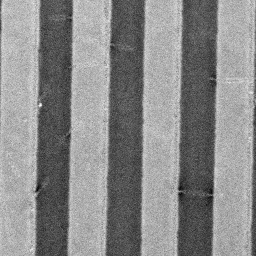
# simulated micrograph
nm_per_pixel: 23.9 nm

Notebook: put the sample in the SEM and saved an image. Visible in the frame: lines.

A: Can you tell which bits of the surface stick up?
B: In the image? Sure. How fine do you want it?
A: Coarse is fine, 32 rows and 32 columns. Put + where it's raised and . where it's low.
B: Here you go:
+++++....+++++....+++++....+++++
+++++....+++++....+++++....+++++
+++++....+++++....+++++....+++++
+++++....+++++....+++++....+++++
+++++....+++++....+++++....+++++
+++++....+++++....+++++....+++++
+++++....+++++....++++.....+++++
+++++....+++++....++++.....+++++
+++++....+++++....++++.....+++++
+++++....+++++....++++.....+++++
+++++....+++++....++++.....+++++
+++++....++++.....++++.....+++++
+++++....++++.....++++.....+++++
+++++....++++.....++++.....+++++
+++++....++++.....++++.....++++.
+++++....++++.....++++.....++++.
+++++....++++.....++++.....++++.
+++++....++++.....++++.....++++.
+++++....++++.....++++.....++++.
++++.....++++.....++++.....++++.
++++.....++++.....++++.....++++.
++++.....++++.....++++.....++++.
++++.....++++.....++++.....++++.
+++++....++++.....++++.....++++.
+++++....++++.....++++.....++++.
++++.....++++.....++++.....++++.
++++.....++++.....++++.....++++.
++++.....++++.....++++.....++++.
++++.....++++.....++++.....++++.
++++.....++++.....++++.....++++.
++++.....++++.....++++.....++++.
++++.....++++.....++++.....++++.